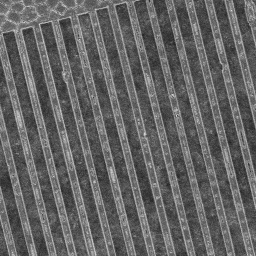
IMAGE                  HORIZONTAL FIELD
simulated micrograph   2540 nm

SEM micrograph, parallel lines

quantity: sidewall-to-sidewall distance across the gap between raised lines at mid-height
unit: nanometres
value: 120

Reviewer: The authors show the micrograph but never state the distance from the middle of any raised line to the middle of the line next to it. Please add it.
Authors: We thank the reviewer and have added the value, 191 nm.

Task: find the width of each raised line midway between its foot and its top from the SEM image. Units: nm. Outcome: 65